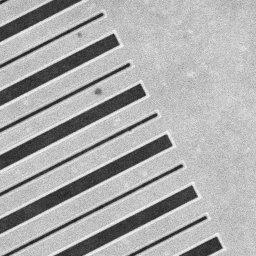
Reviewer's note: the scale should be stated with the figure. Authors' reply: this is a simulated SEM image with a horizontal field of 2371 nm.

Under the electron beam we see parallel lines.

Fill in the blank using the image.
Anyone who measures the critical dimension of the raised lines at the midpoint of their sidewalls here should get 163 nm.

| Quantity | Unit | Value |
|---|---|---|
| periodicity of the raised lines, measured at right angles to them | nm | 262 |